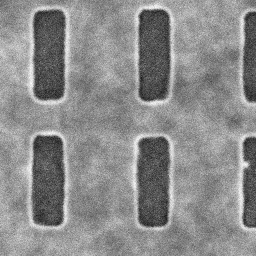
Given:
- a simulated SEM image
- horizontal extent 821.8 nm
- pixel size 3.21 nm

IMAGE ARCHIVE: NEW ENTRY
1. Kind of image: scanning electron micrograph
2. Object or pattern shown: holes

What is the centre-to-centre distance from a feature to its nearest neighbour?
338 nanometers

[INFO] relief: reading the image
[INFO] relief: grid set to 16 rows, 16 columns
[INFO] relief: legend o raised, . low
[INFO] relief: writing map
oooooooooooooooo
oo..ooooo..oooo.
oo..ooooo..oooo.
oo..ooooo..oooo.
oo..ooooo..oooo.
oo..ooooo..oooo.
oooooooooooooooo
oooooooooooooooo
oooooooooooooooo
oo..ooooo..oooo.
oo..oooo...oooo.
oo..oooo...oooo.
oo..ooooo..oooo.
oo..ooooo..oooo.
oooooooooooooooo
oooooooooooooooo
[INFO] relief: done